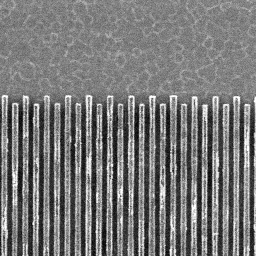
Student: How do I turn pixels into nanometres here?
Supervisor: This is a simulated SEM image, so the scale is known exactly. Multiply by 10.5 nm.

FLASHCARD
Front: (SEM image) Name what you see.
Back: parallel lines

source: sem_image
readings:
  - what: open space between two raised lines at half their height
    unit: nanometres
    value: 63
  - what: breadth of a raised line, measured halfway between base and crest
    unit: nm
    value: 52.5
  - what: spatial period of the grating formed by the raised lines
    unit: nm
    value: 111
